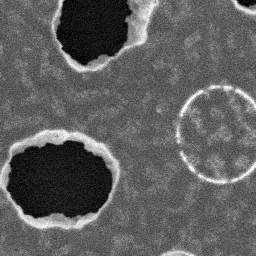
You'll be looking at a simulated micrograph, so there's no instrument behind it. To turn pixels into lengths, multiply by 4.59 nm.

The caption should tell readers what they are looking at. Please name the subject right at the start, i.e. holes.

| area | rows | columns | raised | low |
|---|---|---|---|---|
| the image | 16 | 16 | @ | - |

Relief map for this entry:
@@@@-----@@@@@@-
@@@------@@@@@@@
@@@@----@@@@@@@@
@@@@---@@@@@@@@@
@@@@@@@@@@@@@@@@
@@@@@@@@@@@@@@@@
@@@@@@@@@@@@@@@@
@@@@@@@@@@@@@@@@
@@@@@@@@@@@@@@@@
@-----@@@@@@@@@@
-------@@@@@@@@@
-------@@@@@@@@@
@------@@@@@@@@@
@@----@@@@@@@@@@
@@@@@@@@@@@@@@@@
@@@@@@@@@@@@@@@@